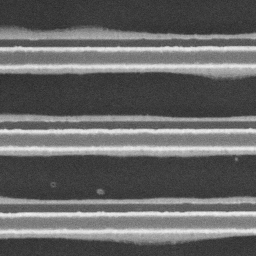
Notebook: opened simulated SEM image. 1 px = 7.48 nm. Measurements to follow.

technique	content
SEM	lines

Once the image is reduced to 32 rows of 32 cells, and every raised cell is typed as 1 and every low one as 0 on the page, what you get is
00000000000000000000000000000000
00000000000000000000000000000000
00000000000000000000000000000000
00000000000000000000000000000000
00000000000000000000000000000000
11111111111111111111111111111111
11111111111111111111111111111111
11111111111111111111111111111111
11111111111111111111111111110111
00000000000000000000000000000000
00000000000000000000000000000000
00000000000000000000000000000000
00000000000000000000000000000000
00000000000000000000000000000000
00000000000000000000000000000000
11111111111111111111111111111111
11111111111111111111111111111111
11111111111111111111111111111111
11111111111111111111111111111111
00000000000000000000000000000000
00000000000000000000000000000000
00000000000000000000000000000000
00000000000000000000000000000000
00000000000000000000000000000000
00000000000000000000000000000000
11111111111111111111111111111111
11111111111111111111111111111111
11111111111111111111111111111111
11111111111111111111111111111111
00000000000000000000000000000000
00000000000000000000000000000000
00000000000000000000000000000000